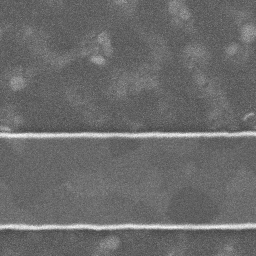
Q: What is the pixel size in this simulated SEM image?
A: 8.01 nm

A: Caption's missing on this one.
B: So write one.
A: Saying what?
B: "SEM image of one or a few lines or trenches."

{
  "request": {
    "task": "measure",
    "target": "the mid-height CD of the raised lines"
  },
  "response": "747 nm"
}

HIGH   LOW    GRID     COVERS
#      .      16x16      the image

................
................
................
................
................
................
................
................
################
################
################
################
################
################
................
................